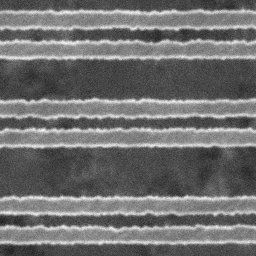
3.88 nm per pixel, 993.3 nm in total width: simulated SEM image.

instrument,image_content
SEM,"lines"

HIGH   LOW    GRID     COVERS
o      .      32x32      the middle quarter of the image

................................
................................
................................
................................
................................
................................
................................
................................
................................
oooooooooooooooooooooooooooooooo
oooooooooooooooooooooooooooooooo
oooooooooooooooooooooooooooooooo
oooooooooooooooooooooooooooooooo
..oo..oo.o.....ooo...oo.........
................................
................................
.ooo..ooo.o.ooo.oooooooo.ooooooo
oooooooooooooooooooooooooooooooo
oooooooooooooooooooooooooooooooo
oooooooooooooooooooooooooooooooo
oooooooooooo.oooo.oo.ooooooooooo
................................
................................
................................
................................
................................
................................
................................
................................
................................
................................
................................